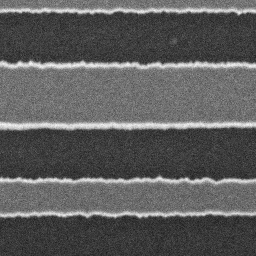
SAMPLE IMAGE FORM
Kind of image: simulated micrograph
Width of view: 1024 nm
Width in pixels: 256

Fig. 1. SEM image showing lines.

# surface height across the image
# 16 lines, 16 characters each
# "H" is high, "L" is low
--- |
HHHHHHHHHHHHHHHH
LLLLLLLLLLLLLLLL
LLLLLLLLLLLLLLLL
LLLLLLLLLLLLLLLL
HHHHHHHHHHHHHHHH
HHHHHHHHHHHHHHHH
HHHHHHHHHHHHHHHH
HHHHHHHHHHHHHHHH
LLLLLLLLLLLLLLLL
LLLLLLLLLLLLLLLL
LLLLLLLLLLLLLLLL
HHHHHHHHHHHHHHHH
HHHHHHHHHHHHHHHH
LLLLLLLLLLLLLLLL
LLLLLLLLLLLLLLLL
LLLLLLLLLLLLLLLL